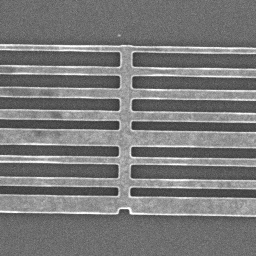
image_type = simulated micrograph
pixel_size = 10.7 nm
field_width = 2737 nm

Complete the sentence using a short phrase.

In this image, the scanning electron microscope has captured groups of lines, slits or small figures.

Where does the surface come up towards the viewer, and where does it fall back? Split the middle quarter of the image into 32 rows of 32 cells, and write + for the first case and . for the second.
..............+++...............
++++++++++++++++++++++++++++++++
...+++++++++++++++++++++++++++++
..............+++...............
..............+++...............
..............+++...............
+++++++++++++++++++++...........
++++++++++++++++++++++++++++++++
.............+++++++..++++++++++
..............+++...............
..............+++...............
..............+++...............
++++++++++++++++++++++++++++++++
++++++++++++++++++++++++++++++++
..............+++...............
..............+++...............
+............++++...............
++++++++++++++++++++++++++++++++
++++++++++++++++++++++++++++++++
++++++++++++++++++++++++++++++++
.............++++..............+
..............+++...............
..............+++...............
+++++++++++++++++++++++++.......
++++++++++++++++++++++++++++++++
..............+++...............
..............+++...............
..............+++...............
.............++++...............
++++++++++++++++++++++++++++++++
++++++++++++++++++++++++++++++++
..............++................